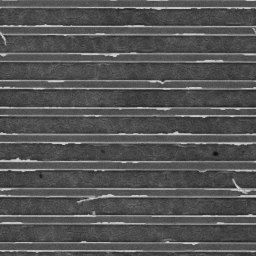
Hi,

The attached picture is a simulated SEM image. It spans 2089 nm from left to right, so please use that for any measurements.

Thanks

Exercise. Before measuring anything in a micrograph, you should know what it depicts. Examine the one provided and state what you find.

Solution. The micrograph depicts parallel lines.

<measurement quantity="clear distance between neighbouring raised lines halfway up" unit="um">0.148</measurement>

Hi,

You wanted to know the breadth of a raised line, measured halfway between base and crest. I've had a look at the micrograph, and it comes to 74.5 nanometres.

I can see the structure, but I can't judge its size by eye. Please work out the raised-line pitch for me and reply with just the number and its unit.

221 nanometers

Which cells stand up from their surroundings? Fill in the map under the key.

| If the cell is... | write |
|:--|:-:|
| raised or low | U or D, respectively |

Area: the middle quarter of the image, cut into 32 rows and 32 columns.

DDDDDDDDDDDDDDDDDDDDDDDDDDDDDDDD
DDDDDDDDDDDDDDDDDDDDDDDDDDDDDDDD
DDDDDDDDDDDDDDDDDDDDDDDDDDDDDDDD
DDDDDDDDDDDDDDDDDDDDDDDDDDDDDDDD
UUUUUUUUUUUUUUUUUUUUUUUUUUUUUUUU
UUUUUUUUUUUUUUUUUUUUUUUUUUUUUUUU
DDDDDDDDDDDDDDDDDDDDDDDDDDDDDDDD
DDDDDDDDDDDDDDDDDDDDDDDDDDDDDDDD
DDDDDDDDDDDDDDDDDDDDDDDDDDDDDDDD
DDDDDDDDDDDDDDDDDDDDDDDDDDDDDDDD
DDDDDDDDDDDDDDDDDDDDDDDDDDDDDDDD
UUUUUUUUUUUUUUUUUUUUUUUUUUUUUUUU
UUUUUUUUUUUUUUUUUUUUUUUUUUUUUUUU
DDDDDDDDDDDDDDDDDDDDDDDDDDDDDDDD
DDDDDDDDDDDDDDDDDDDDDDDDDDDDDDDD
DDDDDDDDDDDDDDDDDDDDDDDDDDDDDDDD
DDDDDDDDDDDDDDDDDDDDDDDDDDDDDDDD
DDDDDDDDDDDDDUUUDUUUDDDUUUUUUUUU
UUUUUUUUUUUUUUUUUUUUUUUUUUUUUUUU
UUUUUUUUUUUUUUUUUUUUUUUUUUUUUUUU
DDDDDDDDDDDDDDDDDDDDDDDDDDDDDDDD
DDDDDDDDDDDDDDDDDDDDDDDDDDDDDDDD
DDDDDDDDDDDDDDDDDDDDDDDDDDDDDDDD
DDDDDDDDDDDDDDDDDDDDDDDDDDDDDDDD
UUUUUUUUUUUUUUUUUUUUUUUUUUUUUUUU
UUUUUUUUUUUUUUUUUUUUUUUUUUUUUUUU
DDDDDDDUUUDDDDDDDDDDDDDUUUUUUUUU
DDDDDDDDDDDDDDDDDDDDDDDDDDDDDDDD
DDDDDDDDDDDDDDDDDDDDDDDDDDDDDDDD
DDDDDDDDDDDDDDDDDDDDDDDDDDDDDDDD
DDDDDDDDDDDDDDDDDDDDDDDDDDDDDDDD
UUUUUUUUUUUUUUUUUUUUUUUUUUUUUUUU